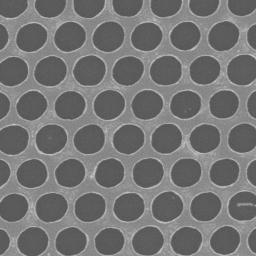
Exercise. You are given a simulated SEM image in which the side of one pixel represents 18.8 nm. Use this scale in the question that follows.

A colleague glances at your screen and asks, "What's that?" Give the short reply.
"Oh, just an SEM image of a regular array of holes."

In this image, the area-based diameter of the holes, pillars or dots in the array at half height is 575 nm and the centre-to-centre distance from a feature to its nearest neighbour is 719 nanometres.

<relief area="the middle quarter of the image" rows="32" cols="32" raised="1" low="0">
01100000001100000000110000000010
01000000000100000000100000000010
01000000001100000000100000000010
11100000001100000001110000000111
11100000011110000011111000001111
11111000111111111111111111111111
11111111111011111111011111111111
00001111100000111100000011110000
00000111000000011000000011100000
00000110000000011000000001100000
00000010000000011000000001000000
00000110000000011000000001100000
00000111000000111000000011100000
00011111100001111100000111111001
11111111111111111111111111111111
11111000011111100011111100001111
11110000001110000000111000000111
01100000001110000000110000000011
01000000001100000000110000000010
01000000001100000000110000000110
11100000001100000000110000000111
11100000011110000011111000001111
11111001111111100111111100111111
11111111111111111111101111111111
00001111100000111110000011110000
00000111000000011100000001100000
00000111000000011000000001100000
00000111000000011000000001100000
00000111000000011000000001100000
00001111000000111100000011100000
00011111100001111110000111110000
11111111111111111111111111111111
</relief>